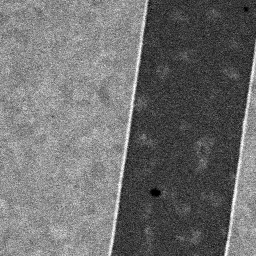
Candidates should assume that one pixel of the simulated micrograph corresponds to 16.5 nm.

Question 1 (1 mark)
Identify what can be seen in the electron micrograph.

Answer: one or a few lines or trenches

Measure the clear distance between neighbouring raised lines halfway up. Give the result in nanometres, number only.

1880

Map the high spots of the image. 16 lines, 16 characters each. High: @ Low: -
@@@@@@@@@-------
@@@@@@@@@-------
@@@@@@@@@-------
@@@@@@@@@-------
@@@@@@@@@-------
@@@@@@@@--------
@@@@@@@@-------@
@@@@@@@@-------@
@@@@@@@@-------@
@@@@@@@@-------@
@@@@@@@@-------@
@@@@@@@--------@
@@@@@@@--------@
@@@@@@@-------@@
@@@@@@@-------@@
@@@@@@@-------@@